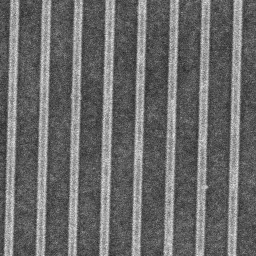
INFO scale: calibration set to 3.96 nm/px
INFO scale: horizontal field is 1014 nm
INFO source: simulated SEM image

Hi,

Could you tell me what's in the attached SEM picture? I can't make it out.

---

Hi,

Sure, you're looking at parallel lines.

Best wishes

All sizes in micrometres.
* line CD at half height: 0.0277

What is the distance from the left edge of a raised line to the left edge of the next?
126 nm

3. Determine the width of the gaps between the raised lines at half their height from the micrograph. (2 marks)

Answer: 98.9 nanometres